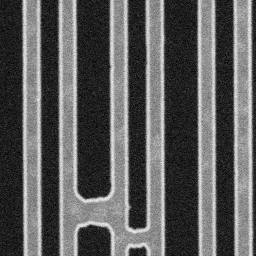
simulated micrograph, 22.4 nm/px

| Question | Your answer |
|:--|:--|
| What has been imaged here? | parallel lines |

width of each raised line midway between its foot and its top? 0.311 um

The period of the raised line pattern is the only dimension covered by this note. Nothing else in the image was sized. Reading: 0.946 micrometres